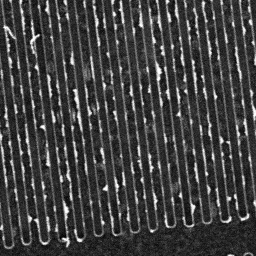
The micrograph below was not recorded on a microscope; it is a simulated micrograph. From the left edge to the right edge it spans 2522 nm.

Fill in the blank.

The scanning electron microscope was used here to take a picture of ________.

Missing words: parallel lines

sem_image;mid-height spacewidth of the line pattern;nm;78.3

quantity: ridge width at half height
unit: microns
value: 0.104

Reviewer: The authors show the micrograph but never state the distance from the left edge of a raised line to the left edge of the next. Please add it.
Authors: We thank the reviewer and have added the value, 179 nanometres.